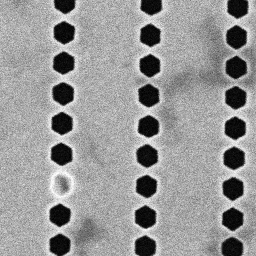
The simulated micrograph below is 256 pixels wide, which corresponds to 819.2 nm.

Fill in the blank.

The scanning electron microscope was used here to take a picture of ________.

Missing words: a regular array of holes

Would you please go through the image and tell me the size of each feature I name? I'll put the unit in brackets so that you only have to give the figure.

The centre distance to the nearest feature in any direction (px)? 30.4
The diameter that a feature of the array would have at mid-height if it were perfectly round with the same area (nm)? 70.3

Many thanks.